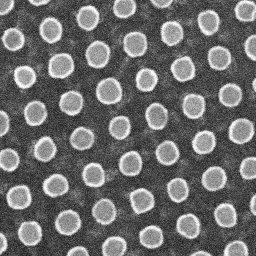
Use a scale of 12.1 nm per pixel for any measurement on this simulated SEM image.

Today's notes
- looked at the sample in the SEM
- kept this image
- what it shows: a regular array of raised bodies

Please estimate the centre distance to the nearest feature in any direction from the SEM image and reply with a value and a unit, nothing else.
453 nanometres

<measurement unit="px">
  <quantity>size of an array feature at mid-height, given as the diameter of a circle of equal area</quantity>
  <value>22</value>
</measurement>